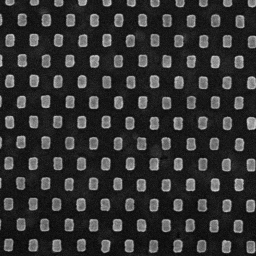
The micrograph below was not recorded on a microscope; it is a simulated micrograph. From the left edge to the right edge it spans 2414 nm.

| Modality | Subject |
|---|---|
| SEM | a regular array of raised bodies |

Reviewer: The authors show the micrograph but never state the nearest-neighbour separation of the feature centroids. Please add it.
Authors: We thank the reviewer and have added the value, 220 nanometres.